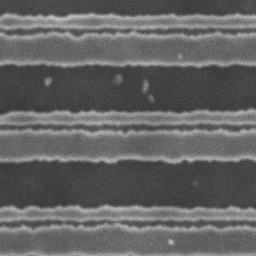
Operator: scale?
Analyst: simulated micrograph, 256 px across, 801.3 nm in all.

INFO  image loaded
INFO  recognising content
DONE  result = lines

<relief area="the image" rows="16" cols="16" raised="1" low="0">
0000000000000000
1111111111111111
1111111111111111
1111111111111111
0000000000000000
0000000000000000
0000000000000000
1111111111111111
1111111111111111
1111111111111111
0000000000000000
0000000000000000
0000000000000000
1111111111111111
1111111111111111
1111111111111111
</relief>